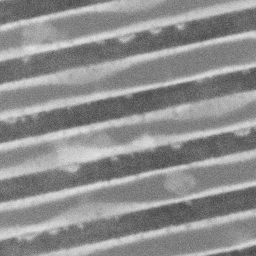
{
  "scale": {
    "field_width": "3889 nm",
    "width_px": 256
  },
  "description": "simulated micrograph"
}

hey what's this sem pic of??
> lines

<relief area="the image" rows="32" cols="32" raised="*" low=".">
...............****************.
.........******************.....
....*******************.........
******************..............
*************.................**
*********................*******
***..................***********
................****************
.............*****************..
........*****************.......
..*******************...........
****************................
***********..................***
******...................*******
*.................**************
.............******************.
........*******************.....
....******************..........
*****************...............
***********...................**
******..................********
**.................*************
...............*****************
...........*******************..
......*******************.......
..******************............
*************...................
*********..................*****
******................**********
.................***************
.............******************.
.........******************.....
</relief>